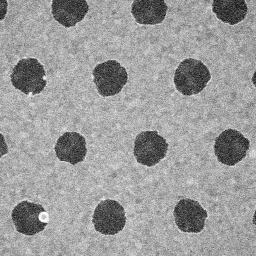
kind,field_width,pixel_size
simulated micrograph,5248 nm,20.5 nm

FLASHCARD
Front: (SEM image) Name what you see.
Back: a regular array of holes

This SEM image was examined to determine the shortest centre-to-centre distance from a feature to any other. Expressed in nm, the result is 1630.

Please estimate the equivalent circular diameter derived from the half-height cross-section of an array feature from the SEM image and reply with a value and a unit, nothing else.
0.717 µm